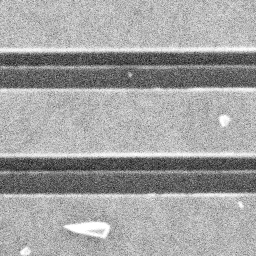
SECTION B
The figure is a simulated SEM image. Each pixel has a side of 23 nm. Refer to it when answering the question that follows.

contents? lines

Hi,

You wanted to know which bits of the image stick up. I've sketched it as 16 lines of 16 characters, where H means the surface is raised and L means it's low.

HHHHHHHHHHHHHHHH
HHHHHHHHHHHHHHHH
HHHHHHHHHHHHHHHH
LLLLLLLLLLLLLLLL
LLLLLLLLLLLLLLLL
LLLLLLLLLLLLLLLL
HHHHHHHHHHHHHHHH
HHHHHHHHHHHHHHHH
HHHHHHHHHHHHHHHH
HHHHHHHHHHHHHHHH
LLLLLLLLLLLLLLLL
LLLLLLLLLLLLLLLL
HHHHHHHHHHHHHHHH
HHHHHHHHHHHHHHHH
HHHHHHHHHHHHHHHH
HHHHHHHHHHHHHHHH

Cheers